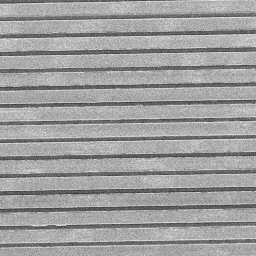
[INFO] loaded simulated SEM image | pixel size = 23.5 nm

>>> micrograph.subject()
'parallel lines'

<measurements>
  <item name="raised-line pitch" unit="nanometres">410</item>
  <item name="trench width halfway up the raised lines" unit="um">0.103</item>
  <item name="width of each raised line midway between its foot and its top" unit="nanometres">308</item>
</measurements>